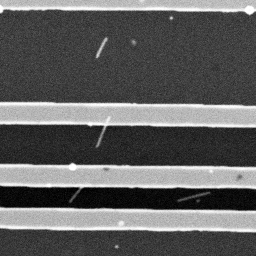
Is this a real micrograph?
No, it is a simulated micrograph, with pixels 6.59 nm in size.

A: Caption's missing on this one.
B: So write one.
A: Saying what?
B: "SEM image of lines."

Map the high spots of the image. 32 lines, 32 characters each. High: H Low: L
HHHHHHHHHHHHHHHHHHHHHHHHHHHHHHHH
LLLLLLLLLLLLLLLLLLLLLLLLLLLLLLLH
LLLLLLLLLLLLLLLLLLLLLLLLLLLLLLLL
LLLLLLLLLLLLLLLLLLLLLLLLLLLLLLLL
LLLLLLLLLLLLLLLLLLLLLLLLLLLLLLLL
LLLLLLLLLLLLLLLLLLLLLLLLLLLLLLLL
LLLLLLLLLLLLLLLLLLLLLLLLLLLLLLLL
LLLLLLLLLLLLLLLLLLLLLLLLLLLLLLLL
LLLLLLLLLLLLLLLLLLLLLLLLLLLLLLLL
LLLLLLLLLLLLLLLLLLLLLLLLLLLLLLLL
LLLLLLLLLLLLLLLLLLLLLLLLLLLLLLLL
LLLLLLLLLLLLLLLLLLLLLLLLLLLLLLLL
LLLLLLLLLLLLLLLLLLLLLLLLLLLLLLLL
HHHHHHHHHHHHHHHHHHHHHHHHHHHHHHHH
HHHHHHHHHHHHHHHHHHHHHHHHHHHHHHHH
LLLLLLLLLLLHHHHHHHHHHHHHHHHHHHHH
LLLLLLLLLLLLLLLLLLLLLLLLLLLLLLLL
LLLLLLLLLLLLLLLLLLLLLLLLLLLLLLLL
LLLLLLLLLLLLLLLLLLLLLLLLLLLLLLLL
LLLLLLLLLLLLLLLLLLLLLLLLLLLLLLLL
LLLLLLLLLLLLLLLLLLLLLLLLLLLLLLLL
HHHHHHHHHHHHHHHHHHHHHHHHHHHHHHHH
HHHHHHHHHHHHHHHHHHHHHHHHHHHHHHHH
LLLLLLLLLLLLLLLLLLLLLLLLLLLLLLLH
LLLLLLLLLLLLLLLLLLLLLLLLLLLLLLLL
LLLLLLLLLLLLLLLLLLLLLLLLLLLLLLLL
HHHHHHHHHHHHHHHHHHHHHHHHHHHHHHHH
HHHHHHHHHHHHHHHHHHHHHHHHHHHHHHHH
LHHHHHHHHHHHHHHHHHHHHHHHHHHHHHHH
LLLLLLLLLLLLLLLLLLLLLLLLLLLLLLLL
LLLLLLLLLLLLLLLLLLLLLLLLLLLLLLLL
LLLLLLLLLLLLLLLLLLLLLLLLLLLLLLLL